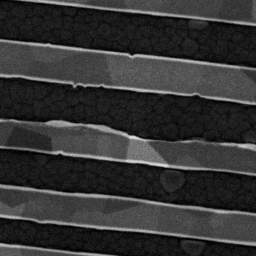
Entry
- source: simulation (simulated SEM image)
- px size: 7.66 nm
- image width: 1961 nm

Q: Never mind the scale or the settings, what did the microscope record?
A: one or a few lines or trenches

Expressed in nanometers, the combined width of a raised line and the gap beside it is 545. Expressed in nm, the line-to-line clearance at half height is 324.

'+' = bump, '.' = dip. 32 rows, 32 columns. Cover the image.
........++++++++++++++++++++++++
.................+++++++++++++++
..........................++++++
................................
................................
++++............................
+++++++++++++...................
++++++++++++++++++++++..........
+++++++++++++++++++++++++++++++.
++++++++++++++++++++++++++++++++
.........+++++++++++++++++++++++
...................+++++++++++++
............................++++
................................
................................
+++++++++.......................
+++++++++++++++.................
++++++++++++++++++..............
..++++++++++++++++++++++++++++++
...........+++++++++++++++++++++
...................+++++++++++++
.............................+++
................................
++..............................
+++++++++++++...................
++++++++++++++++++++............
++++++++++++++++++++++++++++....
....++++++++++++++++++++++++++++
.............+++++++++++++++++++
.......................+++++++++
...............................+
++++++++........................